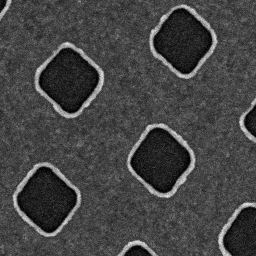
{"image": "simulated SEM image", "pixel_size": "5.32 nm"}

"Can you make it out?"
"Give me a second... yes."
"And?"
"holes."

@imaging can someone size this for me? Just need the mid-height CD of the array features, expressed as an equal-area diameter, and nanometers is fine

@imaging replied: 314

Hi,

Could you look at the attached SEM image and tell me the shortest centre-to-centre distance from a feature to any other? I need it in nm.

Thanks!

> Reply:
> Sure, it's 642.